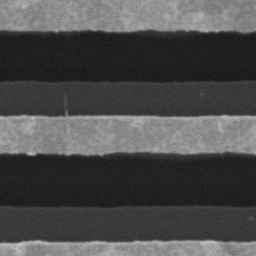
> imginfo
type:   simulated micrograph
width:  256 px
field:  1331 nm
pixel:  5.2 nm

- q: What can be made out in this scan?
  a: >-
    lines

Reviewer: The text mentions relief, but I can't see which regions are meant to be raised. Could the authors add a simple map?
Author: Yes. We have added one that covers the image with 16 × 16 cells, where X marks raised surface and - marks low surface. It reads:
XXXXXXXXXXXXXXXX
XXXXXXXXXXXXXXXX
----------------
----------------
----------------
XXXXXXXXXXXXXXXX
XXXXXXXXXXXXXXXX
XXXXXXXXXXXXXXXX
XXXXXXXXXXXXXXXX
XXXXXXXXXXXXXXXX
----------------
----------------
----------------
XXXXXXXXXXXXXXXX
XXXXXXXXXXXXXXXX
XXXXXXXXXXXXXXXX